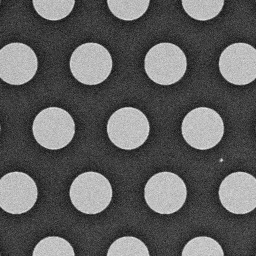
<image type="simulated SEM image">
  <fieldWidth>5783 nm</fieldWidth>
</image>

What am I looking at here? an array of small figures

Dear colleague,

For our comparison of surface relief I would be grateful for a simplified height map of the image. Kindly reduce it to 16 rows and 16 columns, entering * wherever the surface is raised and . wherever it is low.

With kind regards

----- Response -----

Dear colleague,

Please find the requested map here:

..**...**...**..
................
................
**...**..**...**
**...**..**...**
................
................
..**...**...**..
..***..**...**..
................
................
**...**..**...**
**...**..***..**
................
................
..**...**...**..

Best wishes